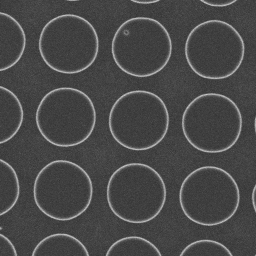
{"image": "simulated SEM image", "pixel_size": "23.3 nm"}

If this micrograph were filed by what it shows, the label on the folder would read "an array of small figures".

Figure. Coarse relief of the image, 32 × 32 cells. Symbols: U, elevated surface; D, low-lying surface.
DDDDDDDDDDDDDDDDDDDDDDDDDDUUUDDD
DDDDDDDDDDDDDDDDDDDDDDDDDDDDDDDD
UUDDDDUUUUUDDDDDUUUDDDDDDDDDDDDD
UUUDDUUUUUUUDDDUUUUUDDDDUUUUUDDD
UUUDDUUUUUUUDDUUUUUUUDDDUUUUUUDD
UUUDDUUUUUUUDDUUUUUUUDDUUUUUUUDD
UUUDDUUUUUUUDDUUUUUUUDDUUUUUUUDD
UUDDDDUUUUUUDDUUUUUUUDDUUUUUUUDD
UDDDDDDUUUUDDDDUUUUUDDDDUUUUUUDD
DDDDDDDDDDDDDDDDDUUDDDDDDUUUUDDD
DDDDDDDDDDDDDDDDDDDDDDDDDDDDDDDD
UDDDDDUUUUDDDDDDUUDDDDDDDDDDDDDD
UUDDDUUUUUUDDDDUUUUUDDDDUUUUUDDD
UUUDDUUUUUUUDDUUUUUUUDDUUUUUUUDD
UUUDDUUUUUUUDDUUUUUUUDDUUUUUUUDD
UUUDDUUUUUUUDDUUUUUUUDDUUUUUUUDD
UUDDDUUUUUUDDDUUUUUUUDDUUUUUUUDD
UDDDDDUUUUUDDDDUUUUUDDDUUUUUUUDD
DDDDDDDDDDDDDDDDUUUDDDDDDUUUUDDD
DDDDDDDDDDDDDDDDDDDDDDDDDDDDDDDD
UDDDDDUUUDDDDDDDUDDDDDDDDDDDDDDD
UUDDDUUUUUUDDDUUUUUUDDDDUUUUDDDD
UUDDDUUUUUUDDDUUUUUUDDDUUUUUUDDD
UUDDUUUUUUUUDUUUUUUUUDDUUUUUUUDD
UUDDUUUUUUUDDUUUUUUUUDUUUUUUUUDD
UUDDDUUUUUUDDDUUUUUUDDDUUUUUUUDD
UDDDDUUUUUDDDDUUUUUUDDDUUUUUUDDD
DDDDDDDUDDDDDDDDUUUDDDDDUUUUDDDD
DDDDDDDDDDDDDDDDDDDDDDDDDDDDDDDD
DDDDDDUUUDDDDDDDDDDDDDDDDDDDDDDD
UUDDDUUUUUDDDDUUUUUDDDDDUUUUDDDD
UUDDUUUUUUUDDUUUUUUUDDDUUUUUUDDD